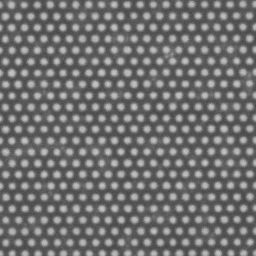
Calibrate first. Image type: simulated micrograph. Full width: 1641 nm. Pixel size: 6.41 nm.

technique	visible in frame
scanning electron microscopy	a regular array of raised bodies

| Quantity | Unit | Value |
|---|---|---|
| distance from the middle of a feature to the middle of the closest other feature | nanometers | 81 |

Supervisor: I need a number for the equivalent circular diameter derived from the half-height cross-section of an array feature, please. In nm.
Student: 42.2